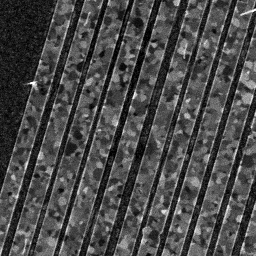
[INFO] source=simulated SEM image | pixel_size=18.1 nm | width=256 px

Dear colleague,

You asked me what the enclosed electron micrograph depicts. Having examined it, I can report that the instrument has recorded parallel lines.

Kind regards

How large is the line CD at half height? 304 nm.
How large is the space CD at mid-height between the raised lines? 128 nanometers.